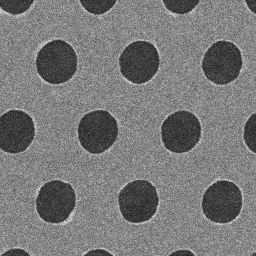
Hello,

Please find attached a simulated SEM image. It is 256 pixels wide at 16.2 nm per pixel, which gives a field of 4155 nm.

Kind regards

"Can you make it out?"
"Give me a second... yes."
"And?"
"a regular array of holes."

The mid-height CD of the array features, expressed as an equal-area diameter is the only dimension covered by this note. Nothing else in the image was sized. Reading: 0.69 um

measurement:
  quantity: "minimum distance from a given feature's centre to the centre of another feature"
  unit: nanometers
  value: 1310